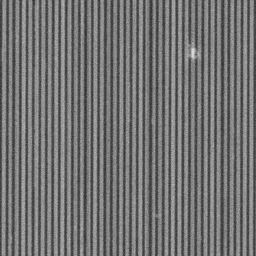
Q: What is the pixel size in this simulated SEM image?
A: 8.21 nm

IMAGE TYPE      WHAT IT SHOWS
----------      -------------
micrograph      parallel lines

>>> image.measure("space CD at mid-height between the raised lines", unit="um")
0.0298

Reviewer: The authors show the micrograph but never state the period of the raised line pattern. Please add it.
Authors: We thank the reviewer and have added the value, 53.5 nm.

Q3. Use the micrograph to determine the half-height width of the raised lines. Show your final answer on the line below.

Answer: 22.6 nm